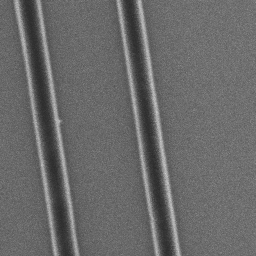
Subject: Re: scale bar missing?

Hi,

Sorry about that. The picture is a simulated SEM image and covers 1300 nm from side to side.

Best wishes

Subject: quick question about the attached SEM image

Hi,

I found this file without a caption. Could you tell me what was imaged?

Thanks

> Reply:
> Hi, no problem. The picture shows one or a few lines or trenches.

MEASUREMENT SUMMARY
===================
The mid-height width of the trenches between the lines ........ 394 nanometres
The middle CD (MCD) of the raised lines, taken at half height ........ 0.111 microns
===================